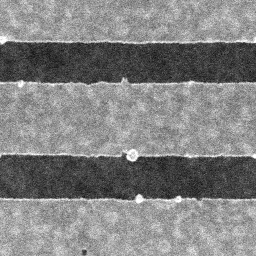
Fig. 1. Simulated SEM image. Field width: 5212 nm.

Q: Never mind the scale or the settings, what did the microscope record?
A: one or a few lines or trenches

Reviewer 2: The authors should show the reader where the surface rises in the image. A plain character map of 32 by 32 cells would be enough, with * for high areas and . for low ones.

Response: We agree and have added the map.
********************************
********************************
**************************.*****
********************************
********************************
................................
................................
................................
................................
................................
******..**..***************.****
********************************
********************************
********************************
********************************
********************************
********************************
********************************
********************************
..........**..*.**.....**.*.**.*
................................
................................
................................
................................
................................
********************************
********************************
********************************
*********.**********************
********************************
********************************
.*********.*********************